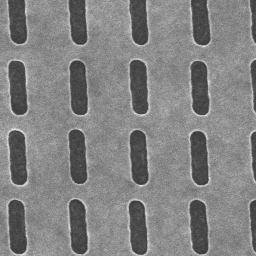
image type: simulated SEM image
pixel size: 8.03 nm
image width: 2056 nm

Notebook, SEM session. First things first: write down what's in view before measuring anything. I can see a regular array of holes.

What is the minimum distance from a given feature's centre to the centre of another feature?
485 nanometers